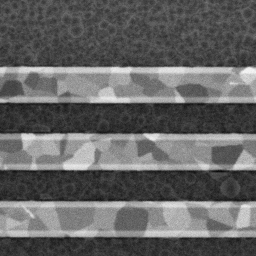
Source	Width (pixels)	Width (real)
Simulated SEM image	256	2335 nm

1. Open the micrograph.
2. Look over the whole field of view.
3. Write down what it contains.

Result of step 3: one or a few lines or trenches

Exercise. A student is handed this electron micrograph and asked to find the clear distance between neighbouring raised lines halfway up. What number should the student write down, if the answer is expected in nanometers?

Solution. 330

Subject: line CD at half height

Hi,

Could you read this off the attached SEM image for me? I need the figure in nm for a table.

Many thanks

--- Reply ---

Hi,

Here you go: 276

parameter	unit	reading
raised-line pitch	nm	613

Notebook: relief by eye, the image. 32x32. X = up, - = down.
--------------------------------
--------------------------------
--------------------------------
--------------------------------
--------------------------------
--------------------------------
--------------------------------
--------------------------------
--------------------------------
XXXXXXXXXXXXXXXXXXXXXXXXXXXXXXXX
XXXXXXXXXXXXXXXXXXXXXXXXXXXXXXXX
XXXXXXXXXXXXXXXXXXXXXXXXXXXXXXXX
--------------------------------
--------------------------------
--------------------------------
--------------------------------
--------------------------------
XXXXXXXXXXXXXXXXXXXXXXXXXXXXXXXX
XXXXXXXXXXXXXXXXXXXXXXXXXXXXXXXX
XXXXXXXXXXXXXXXXXXXXXXXXXXXXXXXX
XXXXXXXXXXXXXXXXXXXXXXXXXXXXXXXX
--------------------------------
--------------------------------
--------------------------------
--------------------------------
--X-----------------------------
XXXXXXXXXXXXXXXXXXXXXXXXXXXXXXXX
XXXXXXXXXXXXXXXXXXXXXXXXXXXXXXXX
XXXXXXXXXXXXXXXXXXXXXXXXXXXXXXXX
--------------------------------
--------------------------------
--------------------------------